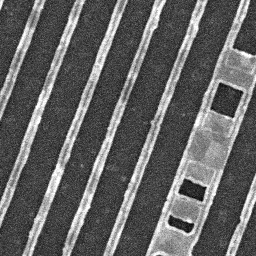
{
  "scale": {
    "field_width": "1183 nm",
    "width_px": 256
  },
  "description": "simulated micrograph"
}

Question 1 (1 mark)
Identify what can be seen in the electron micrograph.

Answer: parallel lines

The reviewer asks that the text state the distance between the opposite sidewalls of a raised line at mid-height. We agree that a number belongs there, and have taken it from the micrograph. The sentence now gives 38.4 nm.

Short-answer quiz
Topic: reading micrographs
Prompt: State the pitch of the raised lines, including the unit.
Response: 177 nanometres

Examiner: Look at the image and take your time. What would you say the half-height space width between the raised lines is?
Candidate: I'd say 0.145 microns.